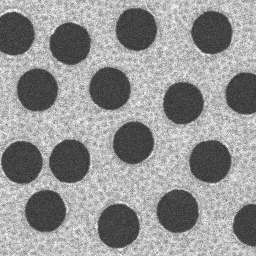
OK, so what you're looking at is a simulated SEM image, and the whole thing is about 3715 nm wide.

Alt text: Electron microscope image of a regular array of holes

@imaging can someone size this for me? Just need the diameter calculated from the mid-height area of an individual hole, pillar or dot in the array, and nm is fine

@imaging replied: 622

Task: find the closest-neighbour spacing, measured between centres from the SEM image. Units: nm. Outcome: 856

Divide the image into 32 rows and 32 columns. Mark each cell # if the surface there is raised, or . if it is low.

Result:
################################
#.#############....#######.#####
....###########....#####.....###
....###....###......####.....###
....##.....####.....####.....###
....##.....####....#####.....###
...###.....##############...####
#######...######################
#############.##################
###....#####....#############...
##.....####.....######..####....
##.....####.....#####....###....
##.....####.....####.....###....
###...#######..#####.....####...
#####################....#######
################..####..########
##############.....#############
########..####.....#######.#####
#....##....###.....#####....####
.....#.....####....#####.....###
.....#.....#####.#######.....###
.....#.....#############.....###
#...###...###############...####
################################
####....############....########
###.....######.#####.....#######
###.....#####....##......#####..
###.....####.....###.....####...
####...#####......##....#####...
############.....#############..
#############...###############.
################################